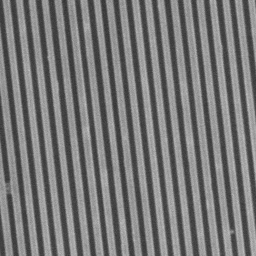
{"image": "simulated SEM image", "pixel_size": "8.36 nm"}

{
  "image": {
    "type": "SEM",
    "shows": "parallel lines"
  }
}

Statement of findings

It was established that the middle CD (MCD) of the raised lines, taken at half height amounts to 48.7 nanometres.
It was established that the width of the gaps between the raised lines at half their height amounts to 57 nanometers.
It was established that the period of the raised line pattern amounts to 107 nm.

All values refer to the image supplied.